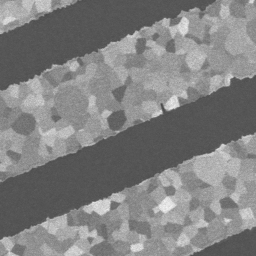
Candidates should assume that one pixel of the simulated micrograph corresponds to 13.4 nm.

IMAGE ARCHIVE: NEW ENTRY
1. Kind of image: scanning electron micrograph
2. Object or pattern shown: one or a few lines or trenches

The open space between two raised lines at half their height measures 718 nm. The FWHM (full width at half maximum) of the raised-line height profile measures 1.13 micrometres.